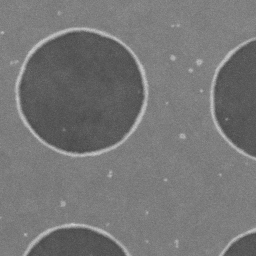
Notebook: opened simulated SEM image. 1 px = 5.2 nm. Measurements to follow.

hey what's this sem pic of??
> holes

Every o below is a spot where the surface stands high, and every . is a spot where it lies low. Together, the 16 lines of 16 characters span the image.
oooooooooooooooo
oooooooooooooooo
ooo....ooooooooo
oo......oooooo..
o........ooooo..
o........oooo...
o........oooo...
oo.......oooo...
oo......oooooo..
oooo..ooooooooo.
oooooooooooooooo
oooooooooooooooo
oooooooooooooooo
oooooooooooooooo
ooo...oooooooooo
oo......oooooo..